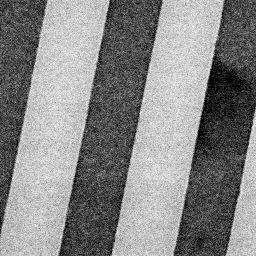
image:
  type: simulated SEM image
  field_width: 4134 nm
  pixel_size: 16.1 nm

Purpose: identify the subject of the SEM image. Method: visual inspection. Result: one or a few lines or trenches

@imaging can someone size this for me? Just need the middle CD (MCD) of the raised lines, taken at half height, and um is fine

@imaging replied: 0.968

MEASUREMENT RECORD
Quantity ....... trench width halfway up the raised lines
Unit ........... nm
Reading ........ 851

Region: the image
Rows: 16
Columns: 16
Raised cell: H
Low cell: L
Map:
LLLHHHHLLLHHHHLL
LLLHHHHLLLHHHHLL
LLLHHHLLLLHHHLLL
LLHHHHLLLHHHHLLL
LLHHHHLLLHHHHLLL
LLHHHHLLLHHHHLLL
LLHHHHLLLHHHHLLL
LLHHHLLLLHHHHLLL
LHHHHLLLHHHHLLLL
LHHHHLLLHHHHLLLH
LHHHHLLLHHHHLLLH
LHHHHLLLHHHHLLLH
LHHHLLLLHHHHLLLH
HHHHLLLHHHHLLLLH
HHHHLLLHHHHLLLHH
HHHHLLLHHHHLLLHH